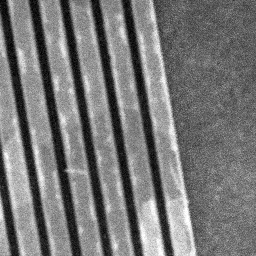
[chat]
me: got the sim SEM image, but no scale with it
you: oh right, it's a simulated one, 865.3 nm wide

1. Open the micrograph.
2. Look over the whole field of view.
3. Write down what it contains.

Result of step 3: parallel lines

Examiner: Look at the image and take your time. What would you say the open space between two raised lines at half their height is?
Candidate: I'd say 38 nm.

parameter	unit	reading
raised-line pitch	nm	103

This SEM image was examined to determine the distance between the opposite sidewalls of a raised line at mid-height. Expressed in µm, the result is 0.0629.